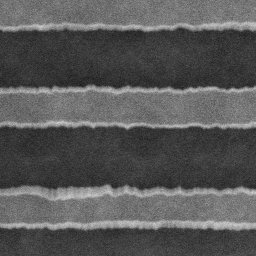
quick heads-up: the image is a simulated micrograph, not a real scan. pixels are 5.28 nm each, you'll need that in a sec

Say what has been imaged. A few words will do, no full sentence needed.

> lines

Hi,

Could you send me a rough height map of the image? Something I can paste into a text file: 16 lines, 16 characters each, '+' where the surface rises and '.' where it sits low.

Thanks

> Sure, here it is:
++++++++++++++++
++++++++++++++++
................
................
................
.....+.......+..
++++++++++++++++
++++++++++++++++
................
................
................
................
++++++++++++++++
++++++++++++++++
................
................